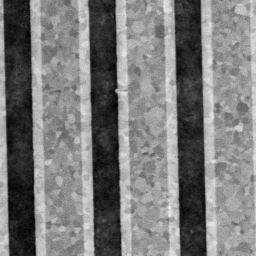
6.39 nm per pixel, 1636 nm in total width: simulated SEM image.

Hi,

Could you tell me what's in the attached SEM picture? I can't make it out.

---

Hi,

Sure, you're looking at one or a few lines or trenches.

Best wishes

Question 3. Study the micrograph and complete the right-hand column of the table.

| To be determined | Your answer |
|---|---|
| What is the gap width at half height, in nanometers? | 227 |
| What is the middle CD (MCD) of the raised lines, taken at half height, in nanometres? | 315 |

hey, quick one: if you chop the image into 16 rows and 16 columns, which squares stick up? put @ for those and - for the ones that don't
--@@@---@@@--@@@
--@@@---@@@--@@@
--@@@---@@@--@@@
--@@@---@@@--@@@
--@@@---@@@--@@@
--@@@---@@@--@@@
--@@@---@@@--@@@
--@@@---@@@--@@@
--@@@---@@@--@@@
--@@@---@@@--@@@
--@@@@--@@@--@@@
--@@@---@@@--@@@
--@@@@--@@@--@@@
--@@@@--@@@--@@@
--@@@@--@@@--@@@
--@@@@--@@@--@@@